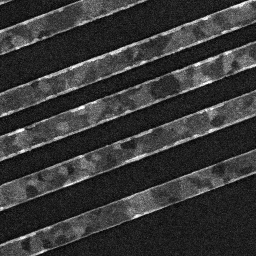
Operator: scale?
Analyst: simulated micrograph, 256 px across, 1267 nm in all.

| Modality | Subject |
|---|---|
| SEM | parallel lines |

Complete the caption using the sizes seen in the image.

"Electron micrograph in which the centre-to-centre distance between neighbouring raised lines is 0.238 µm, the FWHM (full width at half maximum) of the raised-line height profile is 114 nm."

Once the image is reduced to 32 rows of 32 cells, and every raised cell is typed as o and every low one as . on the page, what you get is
.........oooooooo.............oo
......oooooooo.............ooooo
....oooooooo.............ooooooo
.oooooooo.............oooooooo..
ooooooo............oooooooo.....
oooo............ooooooooo......o
o.............oooooooo......oooo
...........oooooooo.......oooooo
.........oooooooo......oooooooo.
......oooooooo......oooooooo....
...oooooooo.......oooooooo......
.oooooooo......oooooooo........o
oooooo......oooooooo.........ooo
ooo.......oooooooo........oooooo
.......oooooooo........ooooooooo
....oooooooo.........oooooooo...
..oooooooo........oooooooo......
ooooooo........ooooooooo........
oooo.........oooooooo...........
oo........oooooooo............oo
.......ooooooooo...........ooooo
.....oooooooo...........oooooooo
..oooooooo............oooooooo..
oooooooo...........oooooooo.....
ooooo...........oooooooo........
oo............oooooooo..........
...........oooooooo.............
........oooooooo................
......ooooooo...................
...oooooooo.....................
oooooooo........................
ooooo...........................